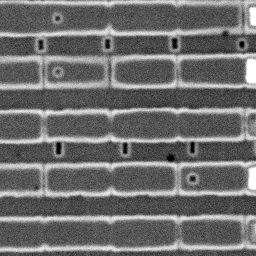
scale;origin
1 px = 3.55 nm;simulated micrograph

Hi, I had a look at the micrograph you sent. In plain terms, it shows wiring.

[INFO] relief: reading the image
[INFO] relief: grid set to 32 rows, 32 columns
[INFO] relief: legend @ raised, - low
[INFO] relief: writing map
@@@@@@@@@@@@@@@@@@@@@@@@@@@@@@@@
@@@@@@@@@@@@@@@@@@@@@@@@@@@@@@@@
@@@@@@@@@@@@@@@@@@@@@@@@@@@@@@@@
@@@@@@@@@@@@@@@@@@@@@@@@@@@@@@@@
--------------------------------
--------------------------------
--------------------------------
@@@@@@@@@@@@@-@@@@@@@@@@@@@@@@@@
@@@@@@@@@@@@@@@@@@@@@@@@@@@@@@@@
@@@@@@@@@@@@@@@@@@@@@@@@@@@@@@@@
@@@@@@@@@@@@@-@@@@@@@@@@@@@@@@@@
--------------------------------
--------------------------------
--------------------------------
@@@@@@@@@@@@@@@@@@@@@@@@@@@@@@@@
@@@@@@@@@@@@@@@@@@@@@@@@@@@@@@@@
@@@@@@@@@@@@@@@@@@@@@@@@@@@@@@@@
@@@@@@@-@@@@@@@@@@@@@@@@@@@@@@--
--------------------------------
--------------------------------
---------------@@@@@@----@@@@@@@
@@@@@@@@@@@@@@@@@@@@@@@@@@@@@@@@
@@@@@@@@@@@@@@@@@@@@@@@@@@@@@@@@
@@@@@@@@@@@@@@@@@@@@@@@@@@@@@@@@
--------------------------------
--------------------------------
--------------------------------
@@@@@@@@@@@@@@@@@@@@@@@@@@@@@@@@
@@@@@@@@@@@@@@@@@@@@@@@@@@@@@@@@
@@@@@@@@@@@@@@@@@@@@@@@@@@@@@@@@
@@@@@@@@@@@@@@@@@@@@@@@@@@@@@@@@
--------------------------------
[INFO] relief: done